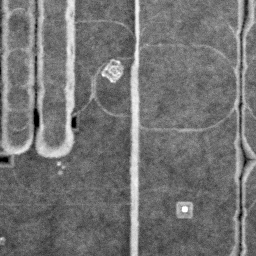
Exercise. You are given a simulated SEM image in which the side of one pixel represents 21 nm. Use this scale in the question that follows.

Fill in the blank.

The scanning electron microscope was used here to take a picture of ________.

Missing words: wiring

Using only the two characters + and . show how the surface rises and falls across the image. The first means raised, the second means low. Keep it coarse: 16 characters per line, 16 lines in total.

++++.....++++++.
++++.....+++++++
++++.....+++++++
++++.....+++++++
++++....++++++++
++++....++++++++
++++....++++++++
++.+....++++++++
++++....++++++++
...+....+++++++.
........+++++++.
........++++++++
........++++++++
........++++++++
........++++++++
........++++++++